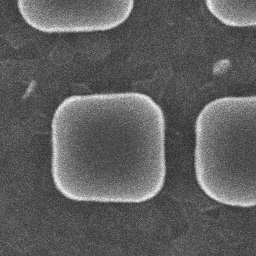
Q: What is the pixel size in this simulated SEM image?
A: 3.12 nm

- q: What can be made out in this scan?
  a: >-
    raised bodies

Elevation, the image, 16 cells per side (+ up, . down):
.+++++++.....+++
..+++++.......++
................
................
................
................
....++++++...+++
...+++++++..++++
...+++++++..++++
...+++++++..++++
...+++++++..++++
....++++++...+++
.....++++.....++
................
................
................